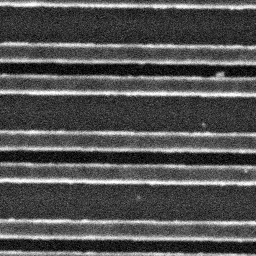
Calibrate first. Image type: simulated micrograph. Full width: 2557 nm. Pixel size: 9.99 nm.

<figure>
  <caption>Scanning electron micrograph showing lines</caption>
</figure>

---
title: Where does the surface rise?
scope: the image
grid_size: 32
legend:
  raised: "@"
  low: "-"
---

@@@@@@@@@@@@@@@@@@@@@@@@@@@@@@@@
--------------------------------
--------------------------------
--------------------------------
--------------------------------
@@@@@---------------------------
@@@@@@@@@@@@@@@@@@@@@@@@@@@@@@@@
@@@@@@@@@@@@@@@@@@@@@@@@@@@@@@@@
--------------------------------
@@@@@@@-------------------------
@@@@@@@@@@@@@@@@@@@@@@@@@@@@@@@@
@@@@@@@@@@@@@@@@@@@@@@@@@@@@@@@@
--------------------------------
--------------------------------
--------------------------------
--------------------------------
@@@@@@@@------------------------
@@@@@@@@@@@@@@@@@@@@@@@@@@@@@@@@
@@@@@@@@@@@@@@@@@@@@@@@@@@@@@@@@
--------------------------------
@@@@--@-------------------------
@@@@@@@@@@@@@@@@@@@@@@@@@@@@@@@@
@@@@@@@@@@@@@@@@@@@@@@@@@@@@@@@@
--------------------------------
--------------------------------
--------------------------------
--------------------------------
-@------------------------------
@@@@@@@@@@@@@@@@@@@@@@@@@@@@@@@@
@@@@@@@@@@@@@@@@@@@@@@@@@@@@@@@@
--------------------------------
@@@-----------------------------